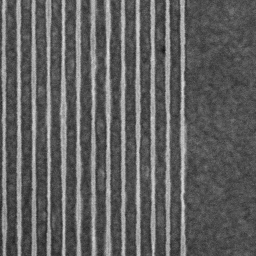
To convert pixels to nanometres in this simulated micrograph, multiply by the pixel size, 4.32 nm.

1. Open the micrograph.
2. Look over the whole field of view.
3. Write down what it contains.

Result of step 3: parallel lines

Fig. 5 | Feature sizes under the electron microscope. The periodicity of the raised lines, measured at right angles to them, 64.2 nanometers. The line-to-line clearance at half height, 52.3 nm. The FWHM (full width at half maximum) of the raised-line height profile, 0.014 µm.